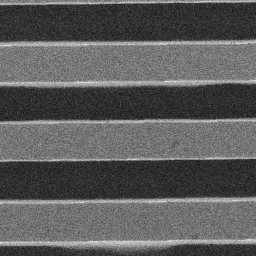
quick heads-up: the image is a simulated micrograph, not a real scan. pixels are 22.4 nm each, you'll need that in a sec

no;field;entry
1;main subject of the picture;lines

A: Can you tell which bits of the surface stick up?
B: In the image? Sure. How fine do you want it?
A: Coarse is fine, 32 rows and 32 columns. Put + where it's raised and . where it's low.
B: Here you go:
................................
................................
................................
................................
................................
..................++++++++++++++
++++++++++++++++++++++++++++++++
++++++++++++++++++++++++++++++++
++++++++++++++++++++++++++++++++
++++++++++++++++++++++++++++++++
................................
................................
................................
................................
................................
++++++++++++++++++++++++++++++++
++++++++++++++++++++++++++++++++
++++++++++++++++++++++++++++++++
++++++++++++++++++++++++++++++++
++++++++++++++++++++++++++++++++
................................
................................
................................
................................
................................
++++++++++++++++++++++++++++++++
++++++++++++++++++++++++++++++++
++++++++++++++++++++++++++++++++
++++++++++++++++++++++++++++++++
++++++++++++++++++++++++++++++++
................................
................................